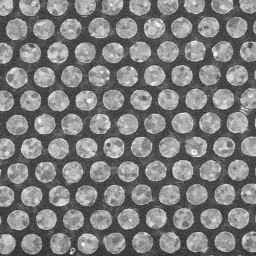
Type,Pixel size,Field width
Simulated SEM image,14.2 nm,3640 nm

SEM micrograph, a regular array of raised bodies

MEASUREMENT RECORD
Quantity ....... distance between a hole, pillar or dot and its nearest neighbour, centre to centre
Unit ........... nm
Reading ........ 385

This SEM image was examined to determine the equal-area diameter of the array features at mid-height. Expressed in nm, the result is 288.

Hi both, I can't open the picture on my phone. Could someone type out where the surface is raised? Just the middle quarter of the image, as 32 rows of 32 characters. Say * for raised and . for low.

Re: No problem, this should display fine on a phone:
.............................*..
****...****...****...****..*****
****..*****..*****..*****..*****
****..*****..*****..*****..*****
****...****...****...***....***.
.**.............................
.........................**.....
....***...****...****...****...*
*..*****..*****..*****..****...*
*..*****..*****..*****..****...*
*..*****..****...****...****...*
................................
.............................**.
****...****...****...****..*****
****...****...****..*****..*****
****...****...****..*****..*****
****...****...****...****...****
.**............*................
..................**.....**.....
*...****..*****..****...****...*
*..*****..*****..*****..*****..*
*..*****..*****..*****..*****..*
*...***...****....***...****...*
................................
.........*............**.....**.
****...****...****...****..*****
*****..****...****...*****.*****
*****..****...****...****..*****
****...****...****...****...***.
.**.............................
.....*......*.....***.....**....
*...****...****..*****..*****..*